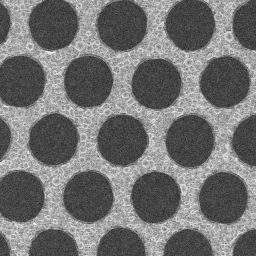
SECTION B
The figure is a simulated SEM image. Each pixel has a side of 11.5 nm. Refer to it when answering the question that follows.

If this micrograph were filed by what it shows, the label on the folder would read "a regular array of raised bodies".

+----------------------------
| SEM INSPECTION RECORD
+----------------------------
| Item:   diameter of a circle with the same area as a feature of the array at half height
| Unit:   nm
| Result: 596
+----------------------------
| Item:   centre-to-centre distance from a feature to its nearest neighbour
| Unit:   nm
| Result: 762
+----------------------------